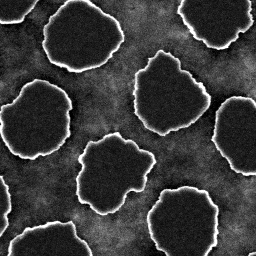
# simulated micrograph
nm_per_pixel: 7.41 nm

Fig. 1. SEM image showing raised bodies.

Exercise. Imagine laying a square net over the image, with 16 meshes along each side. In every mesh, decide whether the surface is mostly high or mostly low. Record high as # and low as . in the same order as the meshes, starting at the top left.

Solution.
##..##.....#####
...####.....####
...#####.....##.
...####...#.....
.........###....
..##....#####...
.###....#####.##
####.....###.###
####.........###
.##..####.....##
.....####......#
.....####.......
#....###..###...
#........#####..
.####....#####..
.#####....###...